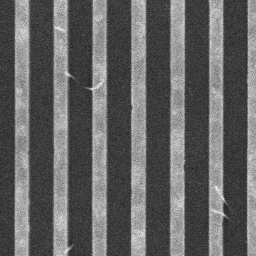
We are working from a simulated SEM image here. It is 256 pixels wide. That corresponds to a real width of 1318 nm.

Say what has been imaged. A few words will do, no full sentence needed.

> parallel lines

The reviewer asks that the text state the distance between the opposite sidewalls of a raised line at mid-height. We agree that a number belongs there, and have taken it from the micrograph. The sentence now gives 75.3 nanometres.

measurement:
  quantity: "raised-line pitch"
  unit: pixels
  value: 38.8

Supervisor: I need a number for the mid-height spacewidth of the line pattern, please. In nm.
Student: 125